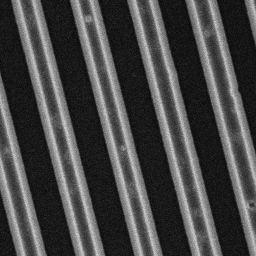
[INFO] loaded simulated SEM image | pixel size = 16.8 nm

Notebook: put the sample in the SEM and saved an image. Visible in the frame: parallel lines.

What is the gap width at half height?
600 nm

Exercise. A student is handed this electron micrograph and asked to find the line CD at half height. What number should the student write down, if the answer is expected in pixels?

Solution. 20.7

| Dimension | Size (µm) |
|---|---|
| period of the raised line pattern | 0.954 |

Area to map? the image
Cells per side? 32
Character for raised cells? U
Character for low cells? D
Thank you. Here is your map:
DDUUUDDDDUUUDDDDDUUDDDDDUUUDDDDU
DDUUUDDDDDUUDDDDDUUUDDDDUUUDDDDU
DDDUUDDDDDUUDDDDDUUUDDDDUUUDDDDD
DDDUUDDDDDUUUDDDDUUUDDDDDUUDDDDD
DDDUUUDDDDUUUDDDDDUUDDDDDUUUDDDD
DDDUUUDDDDDUUDDDDDUUUDDDDUUUDDDD
DDDDUUDDDDDUUDDDDDUUUDDDDUUUDDDD
DDDDUUDDDDDUUUDDDDUUUDDDDDUUUDDD
DDDDUUUDDDDUUUDDDDDUUDDDDDUUUDDD
DDDDUUUDDDDDUUDDDDDUUUDDDDUUUDDD
DDDDDUUDDDDDUUDDDDDUUUDDDDUUUDDD
DDDDDUUDDDDDUUUDDDDUUUDDDDDUUDDD
DDDDDUUUDDDDUUUDDDDDUUDDDDDUUUDD
UDDDDUUUDDDDDUUDDDDDUUUDDDDUUUDD
UDDDDDUUDDDDDUUDDDDDUUUDDDDUUUDD
UDDDDDUUDDDDDUUUDDDDUUUDDDDDUUDD
UDDDDDUUUDDDDUUUDDDDDUUDDDDDUUUD
UUDDDDUUUDDDDDUUDDDDDUUUDDDDUUUD
UUDDDDDUUDDDDDUUDDDDDUUUDDDDUUUD
UUDDDDDUUDDDDDUUUDDDDUUUDDDDDUUU
UUDDDDDUUUDDDDUUUDDDDDUUDDDDDUUU
UUUDDDDUUUDDDDDUUDDDDDUUUDDDDUUU
UUUDDDDDUUDDDDDUUDDDDDUUUDDDDUUU
UUUDDDDDUUDDDDDUUUDDDDUUUDDDDDUU
DUUDDDDDUUUDDDDUUUDDDDDUUDDDDDUU
DUUUDDDDUUUDDDDDUUDDDDDUUUDDDDUU
DUUUDDDDDUUDDDDDUUDDDDDUUUDDDDUU
DUUUDDDDDUUDDDDDUUUDDDDUUUDDDDDU
DDUUDDDDDUUUDDDDUUUDDDDDUUDDDDDU
DDUUUDDDDUUUDDDDDUUDDDDDUUUDDDDU
DDUUUDDDDDUUDDDDDUUDDDDDUUUDDDDU
DDUUUDDDDDUUDDDDDUUUDDDDUUUDDDDD